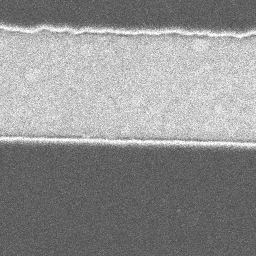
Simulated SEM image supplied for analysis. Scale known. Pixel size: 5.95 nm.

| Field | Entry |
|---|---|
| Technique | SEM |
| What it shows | one or a few lines or trenches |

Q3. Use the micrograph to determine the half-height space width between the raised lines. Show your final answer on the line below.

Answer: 646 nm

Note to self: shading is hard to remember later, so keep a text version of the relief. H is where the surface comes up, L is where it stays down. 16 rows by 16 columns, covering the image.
HHHHHHHHHHHHHHHH
HHHHHHHHHHHHHHHH
LLLLLLLLLLLLLLLL
LLLLLLLLLLLLLLLL
LLLLLLLLLLLLLLLL
LLLLLLLLLLLLLLLL
LLLLLLLLLLLLLLLL
LLLLLLLLLLLLLLLL
LLLLLLLLLLLLLLLL
HHHHHHHHHHHHHHHH
HHHHHHHHHHHHHHHH
HHHHHHHHHHHHHHHH
HHHHHHHHHHHHHHHH
HHHHHHHHHHHHHHHH
HHHHHHHHHHHHHHHH
HHHHHHHHHHHHHHHH